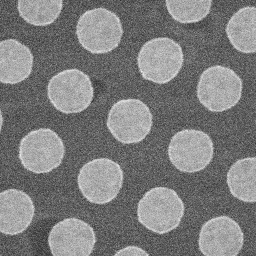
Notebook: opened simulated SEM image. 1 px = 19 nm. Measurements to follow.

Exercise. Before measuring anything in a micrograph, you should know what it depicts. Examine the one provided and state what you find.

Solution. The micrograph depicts a regular array of raised bodies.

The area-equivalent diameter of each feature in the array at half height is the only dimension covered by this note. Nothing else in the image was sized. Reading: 825 nm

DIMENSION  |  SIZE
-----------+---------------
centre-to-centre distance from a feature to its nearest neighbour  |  1260 nm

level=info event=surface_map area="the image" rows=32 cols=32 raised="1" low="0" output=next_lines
00111111000000000000011111000000
00111110000111000000011111000011
00011110001111100000001110000111
00000000001111100000000000001111
00000000001111100000000000000111
11100000001111100011110000000111
11110000000010000011111000000000
11110000000000000111111000000000
11110000000000000011110000110000
11100001111000000011110001111100
00000011111000000000000001111100
00000011111100000000000001111100
00000011111000001000000001111100
00000001111000111100000000110000
00000000000000111110000000000000
00000000000000111110000000000000
00001110000000111100000110000000
00011110000000011000001111000000
00011111000000000000011111000000
00011111000000000000011111000000
00011110000111000000001111000111
00000000001111100000000000000111
00000000001111100000000000000111
00000000001111100000000000000111
11100000000111000011110000000111
11110000000000000111111000000000
11110000000000000111111000000000
11110000110000000011110000011000
11100001111000000001110001111100
00000011111100000000000001111100
00000011111100000000000001111100
00000001111000011100000001111100